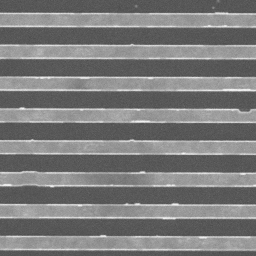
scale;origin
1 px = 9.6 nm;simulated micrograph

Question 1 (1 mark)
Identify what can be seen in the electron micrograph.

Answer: parallel lines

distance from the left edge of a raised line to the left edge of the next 306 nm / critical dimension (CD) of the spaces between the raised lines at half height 0.172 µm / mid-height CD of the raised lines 134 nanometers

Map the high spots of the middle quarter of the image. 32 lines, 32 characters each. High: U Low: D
DDDDDDDDDDDDDDDDDDDDDDDDDDDDDDDD
DDDDDDDDDDDDDDDDDDDDDDDDDDDDDDDD
DDDDDDDDDDDDDDDDDDDDDDDDDDDDDDDD
UUUUUUUUUUUUUUUUUUUUUUUUUUUUUUUU
UUUUUUUUUUUUUUUUUUUUUUUUUUUUUUUU
UUUUUUUUUUUUUUUUUUUUUUUUUUUUUUUU
UUUUUUUUUUUUUUUUUUUUUUUUUUUUUUUU
DDDDDDDDDDDDDDDDDDDDDDDDDDDDDDDD
DDDDDDDDDDDDDDDDDDDDDDDDDDDDDDDD
DDDDDDDDDDDDDDDDDDDDDDDDDDDDDDDD
DDDDDDDDDDDDDDDDDDDDDDDDDDDDDDDD
UUUUUUUUUUUUUUUUUUUUUUUUUUUUUUUU
UUUUUUUUUUUUUUUUUUUUUUUUUUUUUUUU
UUUUUUUUUUUUUUUUUUUUUUUUUUUUUUUU
UUUUUUUUUUUUUUUUUUUUUUUUUUUUUUUU
DDDDDDDDDDDDDDDDDDDDDDDDDDDDDDDD
DDDDDDDDDDDDDDDDDDDDDDDDDDDDDDDD
DDDDDDDDDDDDDDDDDDDDDDDDDDDDDDDD
DDDDDDDDDDDDDDDDDDDDDDDDDDDDDDDD
UUUUUUUUUUUUUUUUUUUUUUUUUUUUUUUU
UUUUUUUUUUUUUUUUUUUUUUUUUUUUUUUU
UUUUUUUUUUUUUUUUUUUUUUUUUUUUUUUU
DDDDDDDDDDUUUUUUUUUUUUUUUUUUUUUU
DDDDDDDDDDDDDDDDDDDDDDDDDDDDDDDD
DDDDDDDDDDDDDDDDDDDDDDDDDDDDDDDD
DDDDDDDDDDDDDDDDDDDDDDDDDDDDDDDD
DDDDDDDDDDDDDDDDDDDDDDDDDDDDDDDD
UUUUUUUUUUUUUUUUUUUUUUUUUUUUUUUU
UUUUUUUUUUUUUUUUUUUUUUUUUUUUUUUU
UUUUUUUUUUUUUUUUUUUUUUUUUUUUUUUU
DDDDDDDDDDDDDDDDDDDDDDDDUUUUUUUU
DDDDDDDDDDDDDDDDDDDDDDDDDDDDDDDD